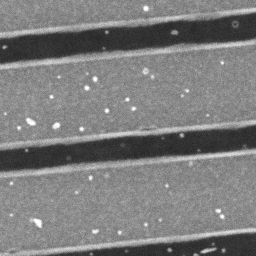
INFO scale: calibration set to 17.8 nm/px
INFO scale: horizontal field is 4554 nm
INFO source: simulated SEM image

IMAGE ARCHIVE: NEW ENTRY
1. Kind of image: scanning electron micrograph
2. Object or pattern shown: lines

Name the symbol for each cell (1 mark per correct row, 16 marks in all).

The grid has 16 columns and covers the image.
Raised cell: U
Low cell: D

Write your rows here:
DDDDDDDDDDDDDDDD
DDDDDDDUUUUUUUUU
UUUUUUUUUUUUUUUU
UUUUUUUDDDDDDDDD
DDDDDDDDDDDDDDDD
DDDDDDDDDDDDDDDD
DDDDDDDDDDDDDDDD
DDDDDDDDDDDDDDDD
DDDDDDDUUUUUUUUU
UUUUUUUUUUUUUUUU
UUUUUDDDDDDDDDDD
DDDDDDDDDDDDDDDD
DDDDDDDDDDDDDDDD
DDDDDDDDDDDDDDDD
DDDDDDDDDDDDDDUU
DDDDDUUUUUUUUUUU